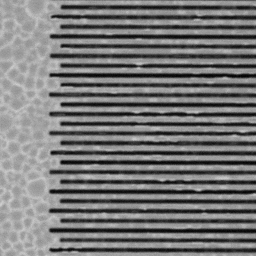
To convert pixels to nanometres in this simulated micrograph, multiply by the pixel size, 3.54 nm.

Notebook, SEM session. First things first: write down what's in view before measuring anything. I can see parallel lines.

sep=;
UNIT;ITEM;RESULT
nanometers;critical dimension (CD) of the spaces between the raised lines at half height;15.5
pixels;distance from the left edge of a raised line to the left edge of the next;9.69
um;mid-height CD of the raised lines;0.0181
